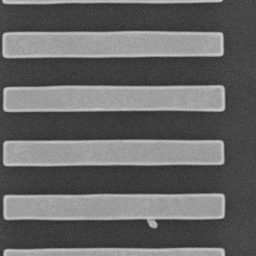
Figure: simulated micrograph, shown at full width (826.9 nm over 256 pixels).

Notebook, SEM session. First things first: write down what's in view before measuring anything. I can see groups of lines, slits or small figures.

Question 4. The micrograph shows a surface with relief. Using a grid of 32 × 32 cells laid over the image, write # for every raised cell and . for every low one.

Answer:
................................
................................
................................
................................
.###########################....
############################....
############################....
................................
................................
................................
................................
############################....
############################....
.###########################....
................................
................................
................................
................................
############################....
############################....
.###########################....
................................
................................
................................
.###########################....
############################....
############################....
................................
................................
................................
................................
.###########################....